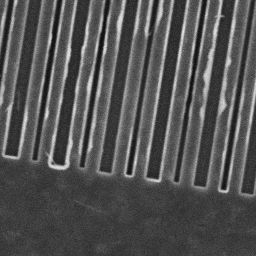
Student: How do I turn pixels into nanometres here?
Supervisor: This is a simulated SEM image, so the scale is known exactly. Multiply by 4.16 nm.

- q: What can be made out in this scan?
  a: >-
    parallel lines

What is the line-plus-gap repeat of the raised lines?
99.3 nm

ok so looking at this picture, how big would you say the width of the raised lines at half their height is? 60.2 nanometres